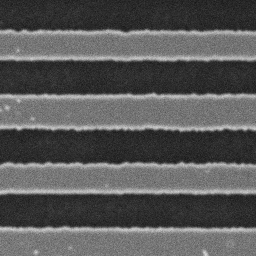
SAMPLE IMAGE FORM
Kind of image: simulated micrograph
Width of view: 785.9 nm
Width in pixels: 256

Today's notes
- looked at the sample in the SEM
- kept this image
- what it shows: lines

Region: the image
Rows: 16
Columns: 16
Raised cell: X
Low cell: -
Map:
----------------
----------------
XXXXXXXXXXXXXXXX
XXXXXXXXXXXXXXXX
----------------
----------------
XXXXXXXXXXXXXXXX
XXXXXXXXXXXXXXXX
----------------
----------------
XXXXXXXXXXXXXXXX
XXXXXXXXXXXXXXXX
----------------
----------------
XXXXXXXXXXXXXXXX
XXXXXXXXXXXXXXXX